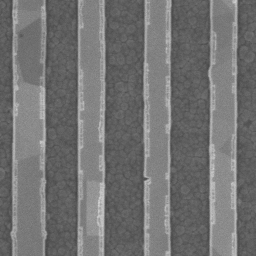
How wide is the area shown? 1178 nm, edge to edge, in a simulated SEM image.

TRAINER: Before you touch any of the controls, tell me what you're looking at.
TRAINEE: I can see one or a few lines or trenches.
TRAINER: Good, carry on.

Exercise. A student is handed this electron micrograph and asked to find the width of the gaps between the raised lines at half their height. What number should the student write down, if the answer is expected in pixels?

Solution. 41.3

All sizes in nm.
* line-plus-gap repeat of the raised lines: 298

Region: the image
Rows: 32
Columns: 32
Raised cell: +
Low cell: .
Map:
..++++....+++.....+++......+++..
..++++....+++.....+++.....+++...
..++++....+++.....+++.....++++..
..++++....+++.....+++......+++..
..++++....+++.....+++......+++..
..++++....+++.....+++......+++..
..++++....+++.....+++......++...
..++++....+++.....+++......++...
..++++....+++.....+++.....+++...
..++++....+++.....+++.....+++...
..++++....+++.....+++.....+++...
..++++....+++.....+++......++...
..++++....+++.....+++......++...
..++++....+++.....+++......++...
..+++.....+++.....+++......++...
..+++.....+++.....+++.....+++...
..+++.....+++.....+++.....+++...
..+++.....+++.....+++.....++++..
..+++.....+++.....+++.....+++...
..+++.....+++.....+++.....+++...
..+++.....+++.....+++.....+++...
..+++.....+++.....+++.....+++...
..++++....+++.....+++.....+++...
..++++....+++.....+++.....+++...
..++++....+++.....+++.....+++...
..++++....+++.....+++.....+++...
..++++....+++.....+++.....+++...
..+++.....+++.....+++.....+++...
..++++....+++.....+++.....+++...
..++++....+++.....+++.....+++...
..+++.....+++.....+++.....+++...
..+++.....+++.....+++.....+++...